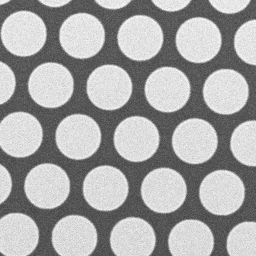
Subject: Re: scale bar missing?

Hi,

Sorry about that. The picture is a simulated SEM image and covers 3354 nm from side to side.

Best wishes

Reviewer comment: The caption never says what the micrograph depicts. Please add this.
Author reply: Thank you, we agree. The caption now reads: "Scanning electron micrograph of an array of small figures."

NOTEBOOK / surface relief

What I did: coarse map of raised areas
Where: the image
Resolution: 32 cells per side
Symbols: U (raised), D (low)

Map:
DDDDDUUUDDDDUUUUDDDUUUUDDDUUUUUD
DDUUDDDDDDDDDDDDDDDDDDDDDDDDUUDD
DUUUUDDDUUUUDDDDUUUDDDDDUUDDDDDD
UUUUUUDDUUUUUDDUUUUUDDUUUUUDDDUU
UUUUUUDUUUUUUDDUUUUUDDUUUUUUDUUU
UUUUUDDDUUUUUDDUUUUUDDUUUUUUDUUU
DUUUUDDDUUUUDDDUUUUUDDUUUUUDDDUU
DDDDDDDDDDDDDDDDDUDDDDDDUUDDDDUU
UDDDDUUUDDDDUUUDDDDDUUDDDDDDDDDD
UUDDUUUUUDDUUUUUDDDUUUUDDDUUUUDD
UUDDUUUUUDDUUUUUDDUUUUUUDDUUUUUD
UUDDUUUUUDDUUUUUDDUUUUUUDUUUUUUD
UDDDUUUUDDDUUUUUDDUUUUUDDDUUUUUD
DDDDDDDDDDDDUUUDDDDUUUUDDDUUUUDD
DUUUDDDDDUUDDDDDDDDDDDDDDDDDDDDD
UUUUUDDDUUUUDDDUUUUDDDDUUUDDDDUU
UUUUUDDUUUUUUDUUUUUUDDUUUUUDDUUU
UUUUUDDUUUUUUDUUUUUUDDUUUUUDDUUU
UUUUUDDUUUUUDDUUUUUUDDUUUUUDDUUU
DDUDDDDDUUUDDDDUUUUDDDUUUUDDDUUU
DDDDDDDDDDDDDDDDDDDDDDDDDDDDDDDU
UDDDUUUUDDDUUUUDDDDUUUDDDDDUUDDD
UDDUUUUUUDDUUUUUDDUUUUUDDUUUUUDD
UDDUUUUUUDUUUUUUDDUUUUUDDUUUUUDD
UDDUUUUUDDDUUUUUDDUUUUUDDUUUUUDD
DDDDUUUUDDDUUUUDDDUUUUUDDUUUUUDD
DDDDDDDDDDDDDDDDDDDDUDDDDDUUUDDD
UUUUDDDDUUUDDDDUUUDDDDDDDDDDDDDD
UUUUUDDUUUUUDDUUUUUDDDUUUUDDDUUU
UUUUUDDUUUUUDDUUUUUDDUUUUUUDDUUU
UUUUUDDUUUUUDDUUUUUDDUUUUUUDUUUU
UUUUDDDUUUUDDDUUUUUDDUUUUUDDDUUU